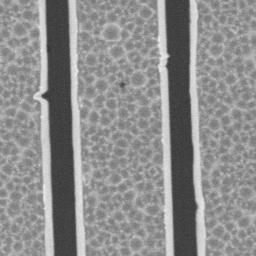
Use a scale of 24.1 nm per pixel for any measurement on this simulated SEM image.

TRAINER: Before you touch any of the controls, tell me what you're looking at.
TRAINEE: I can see one or a few lines or trenches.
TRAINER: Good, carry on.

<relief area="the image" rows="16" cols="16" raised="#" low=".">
###..#####..####
###..#####..####
###..#####..####
###..#####..####
###..#####..####
###..#####..####
###..#####..####
###..#####..####
###..#####..####
###..#####..####
###..#####..####
###..#####..####
###..#####...###
###..#####...###
###..######..###
###..######..###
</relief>